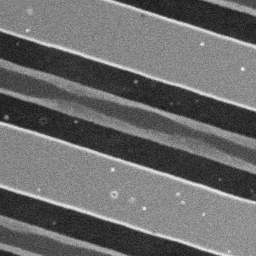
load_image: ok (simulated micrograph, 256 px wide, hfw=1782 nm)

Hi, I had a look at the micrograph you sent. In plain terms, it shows lines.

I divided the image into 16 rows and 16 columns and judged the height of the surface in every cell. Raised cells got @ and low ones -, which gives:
@@@@@@@@--------
@@@@@@@@@@@@----
--@@@@@@@@@@@@@-
-----@@@@@@@@@@@
--------@@@@@@@@
------------@@@@
---------------@
----------------
@@@-------------
@@@@@@----------
@@@@@@@@@-------
@@@@@@@@@@@@----
---@@@@@@@@@@@@@
------@@@@@@@@@@
---------@@@@@@@
------------@@@@